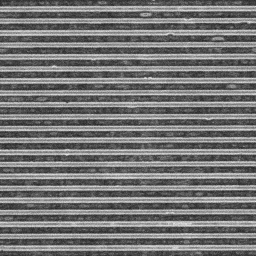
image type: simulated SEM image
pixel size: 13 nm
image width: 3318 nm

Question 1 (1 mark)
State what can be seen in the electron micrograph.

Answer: parallel lines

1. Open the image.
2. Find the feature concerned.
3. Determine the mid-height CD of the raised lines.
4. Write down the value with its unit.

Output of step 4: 56.7 nm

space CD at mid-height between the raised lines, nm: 104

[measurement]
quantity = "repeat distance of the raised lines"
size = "155 nm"